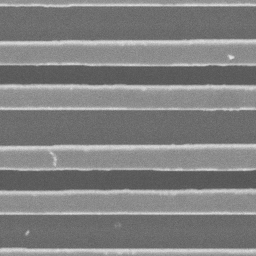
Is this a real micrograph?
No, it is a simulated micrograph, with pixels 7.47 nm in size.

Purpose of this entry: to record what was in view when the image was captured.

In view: lines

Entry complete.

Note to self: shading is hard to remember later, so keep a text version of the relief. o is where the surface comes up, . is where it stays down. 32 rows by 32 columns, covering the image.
oooooooooooooooooooooooooooooooo
................................
................................
................................
................................
oooooooooooooooooooooooooooooooo
oooooooooooooooooooooooooooooooo
oooooooooooooooooooooooooooooooo
................................
................................
................................
oooooooooooooooooooooooooooooooo
oooooooooooooooooooooooooooooooo
oooooooooooooooooooooooooooooooo
................................
................................
................................
................................
oooooooooooooooooooooooooooooooo
oooooooooooooooooooooooooooooooo
oooooooooooooooooooooooooooooooo
................................
................................
................................
oooooooooooooooooooooooooooooooo
oooooooooooooooooooooooooooooooo
oooooooooooooooooooooooooooooooo
................................
................................
................................
................................
oooooooooooooooooooooooooooooooo